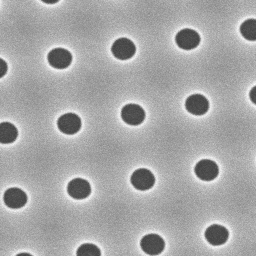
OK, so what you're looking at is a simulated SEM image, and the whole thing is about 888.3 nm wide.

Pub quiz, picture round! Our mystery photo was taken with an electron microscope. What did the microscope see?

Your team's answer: a regular array of holes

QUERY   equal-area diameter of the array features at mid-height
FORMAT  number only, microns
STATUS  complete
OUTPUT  0.0825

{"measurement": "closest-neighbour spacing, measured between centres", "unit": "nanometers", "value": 224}